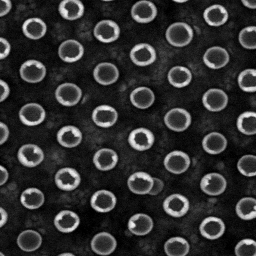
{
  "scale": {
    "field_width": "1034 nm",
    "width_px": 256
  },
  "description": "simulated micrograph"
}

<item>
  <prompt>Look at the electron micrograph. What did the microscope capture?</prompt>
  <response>a regular array of raised bodies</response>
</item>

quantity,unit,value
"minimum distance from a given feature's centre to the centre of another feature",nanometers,166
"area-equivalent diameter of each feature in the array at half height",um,0.092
